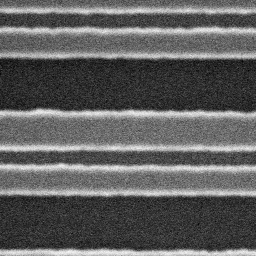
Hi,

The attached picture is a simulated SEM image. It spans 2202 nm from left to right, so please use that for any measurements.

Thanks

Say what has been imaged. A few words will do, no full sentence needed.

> lines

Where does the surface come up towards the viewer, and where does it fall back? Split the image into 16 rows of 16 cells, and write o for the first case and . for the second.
oooooooooooooooo
oooooooooooooooo
oooooooooooooooo
oooooooooooooooo
................
................
................
oooooooooooooooo
oooooooooooooooo
oooooooooooooooo
oooooooooooooooo
oooooooooooooooo
................
................
................
................